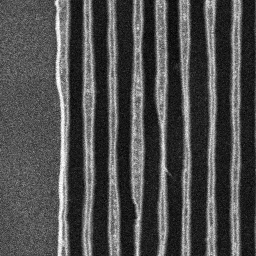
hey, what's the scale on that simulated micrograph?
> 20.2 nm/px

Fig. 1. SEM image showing parallel lines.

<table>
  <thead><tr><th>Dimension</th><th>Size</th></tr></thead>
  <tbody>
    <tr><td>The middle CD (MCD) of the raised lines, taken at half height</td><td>170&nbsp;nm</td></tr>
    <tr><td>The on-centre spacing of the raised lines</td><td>0.497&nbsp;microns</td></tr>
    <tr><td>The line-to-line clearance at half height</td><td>0.322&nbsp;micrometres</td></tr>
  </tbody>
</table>